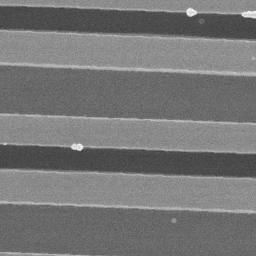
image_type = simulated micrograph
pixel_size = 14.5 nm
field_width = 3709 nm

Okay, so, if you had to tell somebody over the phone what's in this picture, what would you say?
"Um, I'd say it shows lines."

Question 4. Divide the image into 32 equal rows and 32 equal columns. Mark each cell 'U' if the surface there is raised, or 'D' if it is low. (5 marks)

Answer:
UUUUUUUUUUUUUUUUUUUUUUUUUUUUUUUU
DDDDDDDDDDDDDDDDDDDDDDDUUUUUUUUU
DDDDDDDDDDDDDDDDDDDDDDDDDDDDDDDD
DDDDDDDDDDDDDDDDDDDDDDDDDDDDDDDD
UUUUUUUUUUUUUUUUDDDDDDDDDDDDDDDD
UUUUUUUUUUUUUUUUUUUUUUUUUUUUUUUU
UUUUUUUUUUUUUUUUUUUUUUUUUUUUUUUU
UUUUUUUUUUUUUUUUUUUUUUUUUUUUUUUU
DDDDDDDDDDDDDDUUUUUUUUUUUUUUUUUU
DDDDDDDDDDDDDDDDDDDDDDDDDDDDDDDD
DDDDDDDDDDDDDDDDDDDDDDDDDDDDDDDD
DDDDDDDDDDDDDDDDDDDDDDDDDDDDDDDD
DDDDDDDDDDDDDDDDDDDDDDDDDDDDDDDD
DDDDDDDDDDDDDDDDDDDDDDDDDDDDDDDD
UUUUDDDDDDDDDDDDDDDDDDDDDDDDDDDD
UUUUUUUUUUUUUUUUUUUUUUUUUUUUUUUU
UUUUUUUUUUUUUUUUUUUUUUUUUUUUUUUU
UUUUUUUUUUUUUUUUUUUUUUUUUUUUUUUU
DDDDDDDDDUDDDDUUUUUUUUUUUUUUUUUU
DDDDDDDDDDDDDDDDDDDDDDDDDDDDDDDD
DDDDDDDDDDDDDDDDDDDDDDDDDDDDDDDD
UUUUUUDDDDDDDDDDDDDDDDDDDDDDDDDD
UUUUUUUUUUUUUUUUUUUUUUUUUUUUUUUU
UUUUUUUUUUUUUUUUUUUUUUUUUUUUUUUU
UUUUUUUUUUUUUUUUUUUUUUUUUUUUUUUU
DDDDDDUUUUUUUUUUUUUUUUUUUUUUUUUU
DDDDDDDDDDDDDDDDDDDDDDDDDDDDDDDD
DDDDDDDDDDDDDDDDDDDDDDDDDDDDDDDD
DDDDDDDDDDDDDDDDDDDDDDDDDDDDDDDD
DDDDDDDDDDDDDDDDDDDDDDDDDDDDDDDD
DDDDDDDDDDDDDDDDDDDDDDDDDDDDDDDD
DDDDDDDDDDDDDDDDDDDDDDDDDDDDDDDD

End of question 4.